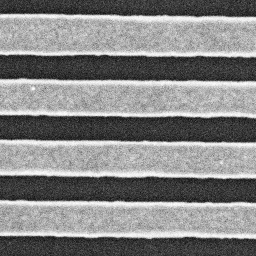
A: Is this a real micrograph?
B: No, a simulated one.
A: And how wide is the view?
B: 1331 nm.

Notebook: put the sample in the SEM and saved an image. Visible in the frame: lines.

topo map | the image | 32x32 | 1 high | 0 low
00000000000000000000000000000000
00000000000000000000000000000000
11111111111111111111111111111111
11111111111111111111111111111111
11111111111111111111111111111111
11111111111111111111111111111111
11111111111111111111111111111111
00000000000000000000000000000000
00000000000000000000000000000000
00000000000000000000000000000000
11111111111111111111111111111111
11111111111111111111111111111111
11111111111111111111111111111111
11111111111111111111111111111111
00000000000000011111100111111111
00000000000000000000000000000000
00000000000000000000000000000000
00000000000000000000000000000000
11111111111111111111111111111111
11111111111111111111111111111111
11111111111111111111111111111111
11111111111111111111111111111111
00000000000000000000000000000000
00000000000000000000000000000000
00000000000000000000000000000000
11111111111111111111111111111111
11111111111111111111111111111111
11111111111111111111111111111111
11111111111111111111111111111111
00000001111111111111111111111111
00000000000000000000000000000000
00000000000000000000000000000000